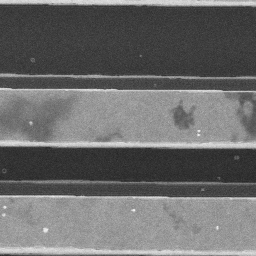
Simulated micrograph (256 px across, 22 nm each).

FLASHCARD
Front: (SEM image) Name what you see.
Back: lines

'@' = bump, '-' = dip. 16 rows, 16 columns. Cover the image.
----------------
----------------
----------------
----------------
----------------
----------------
@@@@@@@@@@@@@@@@
@@@@@@@@@@@@@@@@
@@@@@@@@@@@@@@@@
----------------
----------------
----------------
@@@@@@@@@@@@@@@@
@@@@@@@@@@@@@@@@
@@@@@@@@@@@@@@@@
@@@@@@@@@@@@@@@@